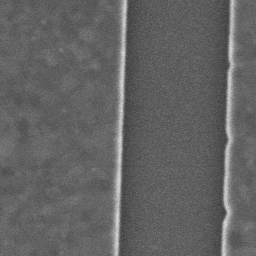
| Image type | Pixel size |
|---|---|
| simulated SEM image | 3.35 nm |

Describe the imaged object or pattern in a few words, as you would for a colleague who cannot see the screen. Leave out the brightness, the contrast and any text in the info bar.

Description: one or a few lines or trenches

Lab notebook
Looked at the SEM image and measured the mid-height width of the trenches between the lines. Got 354 nanometres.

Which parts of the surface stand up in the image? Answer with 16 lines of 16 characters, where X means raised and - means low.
XXXXXXXX------XX
XXXXXXXX------XX
XXXXXXXX------XX
XXXXXXXX------XX
XXXXXXXX------XX
XXXXXXXX------XX
XXXXXXXX------XX
XXXXXXXX------XX
XXXXXXXX------XX
XXXXXXXX------XX
XXXXXXX-------XX
XXXXXXX-------XX
XXXXXXX-------XX
XXXXXXX-------XX
XXXXXXX-------XX
XXXXXXX-------XX